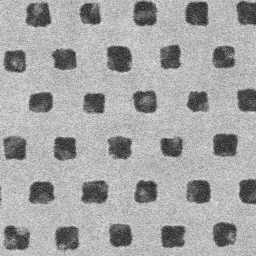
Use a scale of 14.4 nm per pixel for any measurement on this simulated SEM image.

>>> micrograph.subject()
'a regular array of holes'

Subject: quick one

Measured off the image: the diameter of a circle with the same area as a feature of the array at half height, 0.366 micrometres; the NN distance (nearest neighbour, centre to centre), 50.6 px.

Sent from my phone